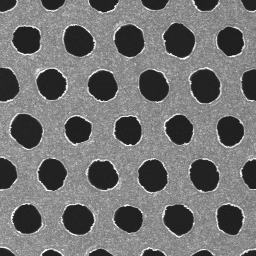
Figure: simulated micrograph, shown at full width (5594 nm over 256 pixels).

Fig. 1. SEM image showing a regular array of holes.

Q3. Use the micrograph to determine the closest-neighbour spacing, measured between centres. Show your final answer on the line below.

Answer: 1100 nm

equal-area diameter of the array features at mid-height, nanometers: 651